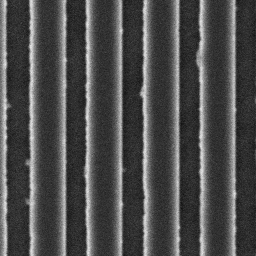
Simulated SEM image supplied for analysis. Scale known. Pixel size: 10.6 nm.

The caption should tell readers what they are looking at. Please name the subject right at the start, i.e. lines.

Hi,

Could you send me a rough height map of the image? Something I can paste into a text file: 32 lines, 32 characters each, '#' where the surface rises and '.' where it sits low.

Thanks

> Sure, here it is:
#...####...####...####...####...
#...####...####...####...####...
#...####...####...####...####...
#...####...####...####...####...
#...####...####...####...####...
#...####...####...####...####...
#...####...####...####...####...
#...####...####...####...####...
#...####...####...####...####...
#...####...####...####...####...
#...####...####...####...####...
#...####...####...####...####...
#...####...####...####...####...
#...####...####...####...####...
#...####...####...####...####...
#...####...####...####...####...
#...####...####...####...####...
#...####...####...####...####...
#...####...####...####...####...
#...####...####...####...####...
#...####...####...####...####...
#...####...####...####...####...
#...####...####...####...####...
#...####...####...####...####...
#...####...####...####...####...
#...####...####...####...####...
#...####...####...####...####...
#...####...####...####...####...
#...####...####...####...####...
#...####...####...####...####...
#...####...####...####...####...
#...####...####...####...####...